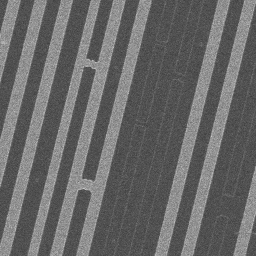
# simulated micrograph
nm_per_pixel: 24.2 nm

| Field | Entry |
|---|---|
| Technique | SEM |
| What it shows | parallel lines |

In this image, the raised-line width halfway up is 264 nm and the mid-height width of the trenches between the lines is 347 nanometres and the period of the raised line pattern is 616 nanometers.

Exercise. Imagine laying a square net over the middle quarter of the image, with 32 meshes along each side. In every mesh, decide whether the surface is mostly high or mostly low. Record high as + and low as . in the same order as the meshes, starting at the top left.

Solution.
...++++++++....+++...+++....+++.
...++...+++....++....+++....+++.
..++....+++...+++....+++.....+..
..++....++....+++....+++........
..++...+++....+++...+++....++...
..++...+++....++....+++....+++..
.++....+++...+++....+++....++...
.++....++....+++....+++...+++...
.++...+++....+++...+++....+++...
.++...+++....++....+++....+++...
++....+++...+++....+++....++....
++....++....+++....+++...+++....
++...+++....+++...+++....+++....
++...+++....++....+++....+++...+
+....+++...+++.....++....++....+
+....++....+++....+.....+++....+
+...+++....+++...+++....+++....+
+...+++....++....+++....+++...++
....+++...+++....+++...+++....++
....++....+++....+++...+++....++
...+++....+++...+++....+++....++
...+++....++....+++....+++...+++
...+++...+++....+++....++....+++
...++....+++....+++...+++....+++
..+++....+++...+++....+++....++.
..+++....++....+++....+++...+++.
..+++...+++....+++....++....+++.
..++....+++....+++...+++....+++.
.+++....+++...+++....+++....++..
.+++++++++....+++....+++...+++..
.+++++++++....+++...+++....+++..
.+++..++++....+++...+++....+++..